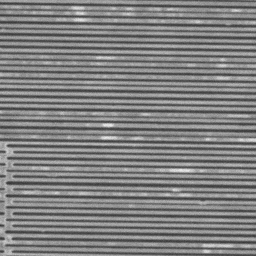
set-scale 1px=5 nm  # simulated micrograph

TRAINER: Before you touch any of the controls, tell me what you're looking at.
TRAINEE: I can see parallel lines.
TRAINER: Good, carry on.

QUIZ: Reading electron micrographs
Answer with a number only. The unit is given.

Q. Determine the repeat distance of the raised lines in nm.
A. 31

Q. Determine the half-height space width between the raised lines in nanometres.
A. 15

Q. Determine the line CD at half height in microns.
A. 0.015